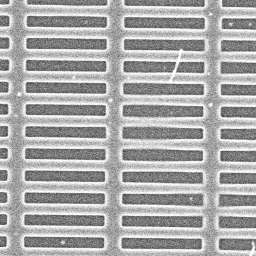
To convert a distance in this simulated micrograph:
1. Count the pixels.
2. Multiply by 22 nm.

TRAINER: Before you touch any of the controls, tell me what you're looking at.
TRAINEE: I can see groups of lines, slits or small figures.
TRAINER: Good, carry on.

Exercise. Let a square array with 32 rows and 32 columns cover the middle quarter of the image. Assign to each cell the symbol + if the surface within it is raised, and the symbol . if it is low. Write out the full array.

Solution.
...........++++.................
...........++++.................
++++++++++++++++++++++++++++++++
++++++++++++++++++++++++++++++++
.+++++++++++++++++++++++++++++++
...........++++.................
...........+++..................
..........+++++.................
++++++++++++++++++++++++++++++++
++++++++++++++++++++++++++++++++
..........+++++.................
...........+++..................
..........++++..................
+++++++++++++++++++++...++++++++
++++++++++++++++++++++++++++++++
..........+++++..........+++++++
...........+++..................
...........+++..................
..........+++++.................
++++++++++++++++++++++++++++++++
++++++++++++++++++++++++++++++++
..........+++++.................
...........+++..................
..........++++..................
++++++++++++++++++++............
++++++++++++++++++++++++++++++++
++++++++++++++++++++++++++++++++
..........++++..................
..........++++..................
..........+++++.................
++++++++++++++++++++++++++++++++
++++++++++++++++++++++++++++++++